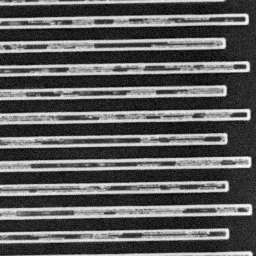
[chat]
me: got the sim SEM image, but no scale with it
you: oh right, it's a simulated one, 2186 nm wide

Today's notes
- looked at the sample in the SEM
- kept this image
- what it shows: parallel lines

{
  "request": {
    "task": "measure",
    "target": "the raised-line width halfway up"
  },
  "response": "73.6 nm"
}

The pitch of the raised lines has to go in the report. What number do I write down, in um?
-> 0.203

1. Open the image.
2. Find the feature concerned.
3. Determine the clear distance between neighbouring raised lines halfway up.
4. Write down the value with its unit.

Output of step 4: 132 nm